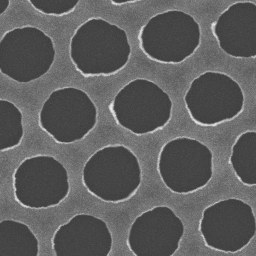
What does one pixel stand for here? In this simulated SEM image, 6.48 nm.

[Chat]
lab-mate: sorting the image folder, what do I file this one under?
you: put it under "a regular array of holes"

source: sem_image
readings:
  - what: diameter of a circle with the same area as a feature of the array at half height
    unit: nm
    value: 353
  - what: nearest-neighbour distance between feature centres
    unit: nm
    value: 468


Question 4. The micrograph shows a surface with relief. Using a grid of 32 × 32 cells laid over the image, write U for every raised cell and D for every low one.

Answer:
DUUUDDDDDUUUUUUUUUUUUUUUUUUUUDDD
UUUUUUDDUUUUUUUUUUUUUDDUUUUUDDDD
UUUUUUUUUUUDDUUUUUUDDDDDUUUDDDDD
UUUDUUUUUUDDDDDUUUDDDDDDDUUDDDDD
UDDDDDUUUDDDDDDDUUDDDDDDDUUDDDDD
DDDDDDDUUDDDDDDDUUDDDDDDDUUDDDDD
DDDDDDDUUDDDDDDDUUDDDDDDUUUUDDDD
DDDDDDDUUDDDDDDDUUUUDDDUUUUUUUUU
DDDDDDUUUUDDDDDUUUUUUUUUUUUUUUUU
UDDDDUUUUUUUUUUUUUUUUUUUUDDDUUUU
UUUUUUUUUUUUUUUUDDDUUUUUDDDDDDUU
UUUUUUUDDDUUUUUDDDDDDUUDDDDDDDUU
UUUUUUDDDDDUUUDDDDDDDUUDDDDDDDUU
DDUUUDDDDDDDUUDDDDDDDUUUDDDDDDUU
DDDUUDDDDDDDUUUDDDDDDUUUDDDDDUUU
DDDUUDDDDDDDUUUDDDDDDUUUUUUUUUUU
DDDUUUDDDDDUUUUUUDDUUUUUUUUUUUUU
DDDUUUUDDDUUUUUUUUUUUUDDUUUUUUDD
DUUUUUUUUUUUUDDDUUUUDDDDDDUUUDDD
UUUUUUUUUUUUDDDDDUUUDDDDDDDUUDDD
UUUDDDDDUUUDDDDDDUUUDDDDDDUUUDDD
UUDDDDDDUUDDDDDDDDUUDDDDDDUUUDDD
UUDDDDDDUUUDDDDDDDUUDDDDDDUUUUDD
UUDDDDDDDUUDDDDDDUUUUDDDDUUUUUUU
UUDDDDDDUUUUDDDDUUUUUUUUUUUUUUUU
UUUDDDDUUUUUUUUUUUUUUUUUUUUDDDDU
UUUUUUUUUUUUUUUUUUDDDDUUUUDDDDDD
UUUUUUUUUDDDDUUUUDDDDDUUUDDDDDDD
DDDDUUUUDDDDDUUUDDDDDDDUUDDDDDDD
DDDDUUUDDDDDDDUUDDDDDDDUUDDDDDDD
DDDDDUUDDDDDDDUUDDDDDDUUUUDDDDDU
DDDDDUUDDDDDDDUUUDDDDDUUUUUUUUUU